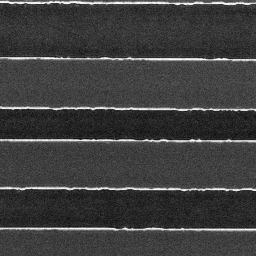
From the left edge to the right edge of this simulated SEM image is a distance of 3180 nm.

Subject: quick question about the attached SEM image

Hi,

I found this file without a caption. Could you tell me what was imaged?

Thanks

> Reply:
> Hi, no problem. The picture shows lines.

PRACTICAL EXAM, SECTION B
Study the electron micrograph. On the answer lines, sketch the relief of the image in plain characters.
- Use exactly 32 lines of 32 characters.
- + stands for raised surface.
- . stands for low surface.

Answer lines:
.....................++++...++++
................................
................................
................................
................................
................................
................................
++++++++++++++++++++++++++.++...
++++++++++++++++++++++++++++++++
++++++++++++++++++++++++++++++++
++++++++++++++++++++++++++++++++
++++++++++++++++++++++++++++++++
++++++++++++++++++++++++++++++++
++++++++++++++++++++++++++++++++
................................
................................
................................
................................
++++++++++++++++++++++++++++++++
++++++++++++++++++++++++++++++++
++++++++++++++++++++++++++++++++
++++++++++++++++++++++++++++++++
++++++++++++++++++++++++++++++++
++++++++++++++++++++++++++++++++
................................
................................
................................
................................
................................
++++++++++++++++++++++++++++++++
++++++++++++++++++++++++++++++++
++++++++++++++++++++++++++++++++